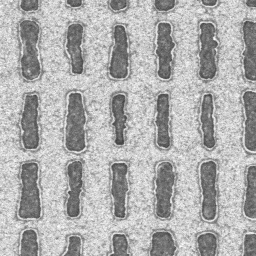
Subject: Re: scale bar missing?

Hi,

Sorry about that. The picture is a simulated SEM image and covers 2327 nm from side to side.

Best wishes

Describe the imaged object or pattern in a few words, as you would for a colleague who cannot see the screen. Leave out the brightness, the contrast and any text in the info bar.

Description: a regular array of holes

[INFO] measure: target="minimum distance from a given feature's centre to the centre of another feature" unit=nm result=405